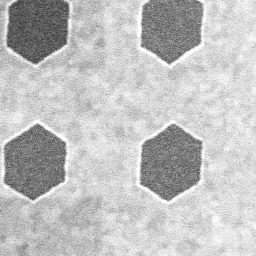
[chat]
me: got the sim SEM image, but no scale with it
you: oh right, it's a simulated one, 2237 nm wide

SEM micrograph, holes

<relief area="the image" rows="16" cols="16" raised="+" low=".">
+...+++++....+++
....+++++....+++
....+++++....+++
+..+++++++.+++++
++++++++++++++++
++++++++++++++++
++++++++++++++++
++++++++++++++++
+...++++++..++++
....+++++....+++
....+++++....+++
....+++++...++++
++++++++++.+++++
++++++++++++++++
++++++++++++++++
++++++++++++++++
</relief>